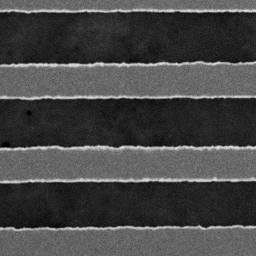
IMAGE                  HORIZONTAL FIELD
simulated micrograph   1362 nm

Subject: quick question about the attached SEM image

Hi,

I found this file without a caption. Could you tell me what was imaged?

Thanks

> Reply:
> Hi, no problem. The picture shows lines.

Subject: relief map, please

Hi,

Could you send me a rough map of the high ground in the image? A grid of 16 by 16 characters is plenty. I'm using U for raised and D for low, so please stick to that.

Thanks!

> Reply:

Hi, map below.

UUUUUUUUUUUUUUUU
DDDDDDDDDDDDDDDD
DDDDDDDDDDDDDDDD
DDDDDDDDDDDDDDDD
UUUUUUUUUUUUUUUU
UUUUUUUUUUUUUUUU
DDDDDDDDDDDDDDDD
DDDDDDDDDDDDDDDD
DDDDDDDDDDDDDDDD
UUUUUUUUUUUUUUUU
UUUUUUUUUUUUUUUU
DDDDDDDDDDDDDDDD
DDDDDDDDDDDDDDDD
DDDDDDDDDDDDDDDD
UUUUUUUUUUUUUUUU
UUUUUUUUUUUUUUUU